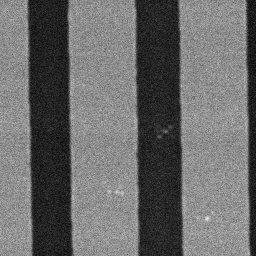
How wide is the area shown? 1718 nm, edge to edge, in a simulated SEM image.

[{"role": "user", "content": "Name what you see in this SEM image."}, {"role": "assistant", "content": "lines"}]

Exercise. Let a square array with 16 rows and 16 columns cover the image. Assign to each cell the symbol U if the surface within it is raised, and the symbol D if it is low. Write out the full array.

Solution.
UUDDUUUUDDDUUUUD
UUDDUUUUDDDUUUUD
UUDDUUUUDDDUUUUD
UUDDUUUUDDDUUUUD
UUDDUUUUUDDUUUUD
UUDDUUUUUDDUUUUD
UUDDUUUUUDDUUUUD
UUDDUUUUUDDUUUUD
UUDDUUUUUDDUUUUD
UUDDUUUUUDDUUUUD
UUDDUUUUUDDUUUUD
UUDDUUUUUDDUUUUD
UUDDUUUUUDDUUUUU
UUDDUUUUUDDUUUUU
UUDDDUUUUDDUUUUU
UUDDDUUUUDDUUUUU